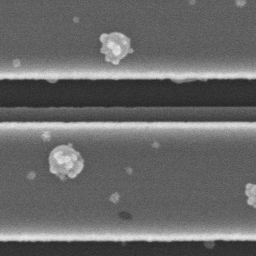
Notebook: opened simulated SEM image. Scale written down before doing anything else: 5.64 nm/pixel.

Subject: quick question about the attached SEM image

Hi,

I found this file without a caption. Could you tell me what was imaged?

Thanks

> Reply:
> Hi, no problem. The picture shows lines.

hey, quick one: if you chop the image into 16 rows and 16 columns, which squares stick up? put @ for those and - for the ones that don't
@@@@@@@@@@@@@@@@
@@@@@@@@@@@@@@@@
@@@@@@@@@@@@@@@@
@@@@@@@@@@@@@@@@
@@@@@@@@@@@@@@@@
----------------
----------------
----------------
@@@@@@@@@@@@@@@@
@@@@@@@@@@@@@@@@
@@@@@@@@@@@@@@@@
@@@@@@@@@@@@@@@@
@@@@@@@@@@@@@@@@
@@@@@@@@@@@@@@@@
@@@@@@@@@@@@@@@@
----------------